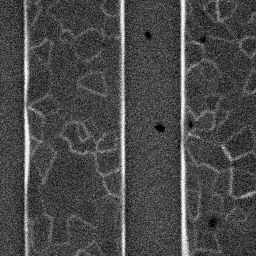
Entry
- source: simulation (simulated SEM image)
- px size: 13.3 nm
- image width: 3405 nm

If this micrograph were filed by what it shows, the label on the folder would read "wiring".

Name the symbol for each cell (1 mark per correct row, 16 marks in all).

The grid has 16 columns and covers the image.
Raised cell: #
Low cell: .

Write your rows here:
..######...#####
..######...#####
..######...#####
..######...#####
..######...#####
..######...#####
..######...#####
..######...#####
..######...#####
..######...#####
..######...#####
..######...#####
..######...#####
..######...#####
..######...#####
..######....####